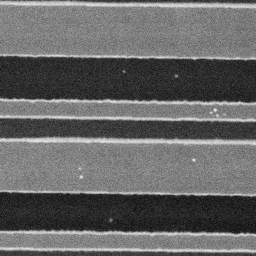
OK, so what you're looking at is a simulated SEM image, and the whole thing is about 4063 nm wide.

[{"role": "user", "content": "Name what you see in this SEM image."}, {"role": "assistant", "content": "lines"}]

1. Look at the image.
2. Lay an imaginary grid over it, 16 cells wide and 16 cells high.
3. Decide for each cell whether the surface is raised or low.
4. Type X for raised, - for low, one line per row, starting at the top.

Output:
XXXXXXXXXXXXXXXX
XXXXXXXXXXXXXXXX
XXXXXXXXXXXXXXXX
--XXXXXXXXXXXXXX
----------------
----------------
XXXXXXXXXXXXXXXX
XXXXXXXXXXXXXXXX
XXXXXXXXXXXXXXXX
XXXXXXXXXXXXXXXX
XXXXXXXXXXXXXXXX
XXXXXXXXXXXXXXXX
----------------
----------------
----------------
XXXXXXXXXXXXXXXX